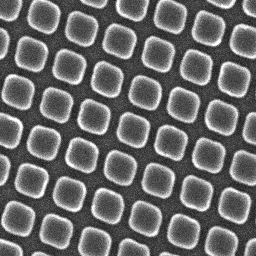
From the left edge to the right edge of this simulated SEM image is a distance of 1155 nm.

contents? a regular array of raised bodies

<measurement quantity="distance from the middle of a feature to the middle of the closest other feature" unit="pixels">39.8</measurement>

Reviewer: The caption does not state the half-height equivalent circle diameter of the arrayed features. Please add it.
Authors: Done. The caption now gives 148 nm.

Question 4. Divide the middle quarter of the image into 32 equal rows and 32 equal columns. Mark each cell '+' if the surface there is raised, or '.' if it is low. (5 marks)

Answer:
+++++...+++++........++++++..+++
+++++...++++++.........+++...+++
+++++..++++++++..............+++
+++++..++++++++...+++.........++
.+++...+++++++...++++++.........
.......+++++++...+++++++........
........++++++...+++++++...++++.
+........+++++..++++++++...+++++
++..............++++++++..++++++
++...+++.........+++++++..++++++
++..++++++.........++++...++++++
++..+++++++...............++++++
++..+++++++....++..........+++++
+...+++++++...+++++.........++++
....+++++++...+++++++.........++
....+++++++...+++++++....+......
.....++++++...+++++++...+++++...
.............++++++++..+++++++..
..............+++++++..++++++++.
..++++.........+++++...++++++++.
.+++++++.........+++...+++++++..
.+++++++...............+++++++..
.+++++++...++++.........++++++..
.+++++++...++++++..........++...
.+++++++..++++++++..............
..++++++..++++++++...+++........
....+++...++++++++..++++++......
..........++++++++..+++++++.....
++.........++++++...++++++++...+
++++.........++++...+++++++...++
+++++...............+++++++...++
+++++....++.........+++++++...++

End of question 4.